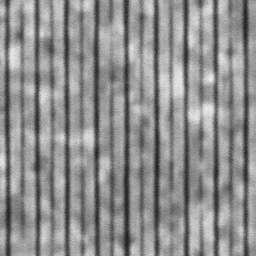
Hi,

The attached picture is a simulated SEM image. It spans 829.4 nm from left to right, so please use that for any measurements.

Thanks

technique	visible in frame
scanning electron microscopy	parallel lines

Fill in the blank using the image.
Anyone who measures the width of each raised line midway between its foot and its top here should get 36.1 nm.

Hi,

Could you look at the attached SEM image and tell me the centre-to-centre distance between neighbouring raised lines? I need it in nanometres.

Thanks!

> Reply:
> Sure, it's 48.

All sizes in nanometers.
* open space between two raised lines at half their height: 13.8